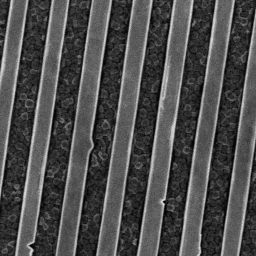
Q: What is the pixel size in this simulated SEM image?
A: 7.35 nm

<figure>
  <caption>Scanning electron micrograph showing parallel lines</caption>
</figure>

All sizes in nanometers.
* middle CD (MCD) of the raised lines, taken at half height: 133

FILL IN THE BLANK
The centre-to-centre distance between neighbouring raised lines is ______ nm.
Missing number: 299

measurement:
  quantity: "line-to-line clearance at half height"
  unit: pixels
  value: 22.6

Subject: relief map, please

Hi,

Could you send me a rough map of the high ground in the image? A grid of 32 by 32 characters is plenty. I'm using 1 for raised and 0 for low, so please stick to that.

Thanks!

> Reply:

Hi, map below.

01100001100111000110001100011000
01100011000111001110001100011000
01100011000111001110011100011000
01100011000110001110011100011000
01100011000110001100011100111000
01100011000110001100011000110001
01100011000110001100011000110001
11000010001110001100011000110001
11000110001110011100011000110001
11000110001110011100111000110001
11000110001100011000111000110001
11000110001100011000111001110011
11000110001100011000110001100011
11000110001100011000110001100011
10001110001100011000110001100011
10001100011100011000110001100011
10001100011100111001110001100011
10001100011100110001110011100011
10001100011100110001110011100011
10001100011000110001100011000111
10001100011000110001100011000110
00001100011000110001100011000110
00011000111000110001100011000110
00011000111001110001100011000110
00011000110001100011100011000110
00011000110001100011000111000110
00011000110001100011000110001110
00011000110001100011000110001110
00111000110001100011000110001100
00110001110011100011000110001100
00110001110011100111000110001100
00110001100011100111000110001100